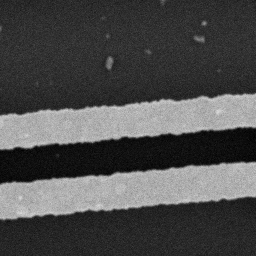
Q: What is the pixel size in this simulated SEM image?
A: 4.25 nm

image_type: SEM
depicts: lines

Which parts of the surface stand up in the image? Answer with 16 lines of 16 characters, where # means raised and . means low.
................
................
................
................
................
................
.........#######
################
##########......
................
...........#####
################
#############...
##..............
................
................